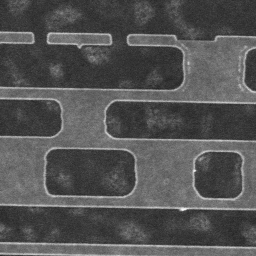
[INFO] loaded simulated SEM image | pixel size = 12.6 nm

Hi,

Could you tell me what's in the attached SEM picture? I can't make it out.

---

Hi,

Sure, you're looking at parallel lines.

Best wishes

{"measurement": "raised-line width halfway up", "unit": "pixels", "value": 11.6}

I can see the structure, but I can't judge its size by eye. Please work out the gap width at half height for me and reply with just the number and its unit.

485 nm